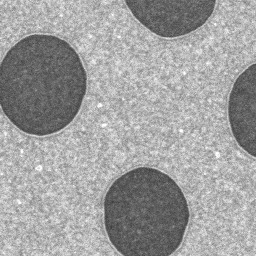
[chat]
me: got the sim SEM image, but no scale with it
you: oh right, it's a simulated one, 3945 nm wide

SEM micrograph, holes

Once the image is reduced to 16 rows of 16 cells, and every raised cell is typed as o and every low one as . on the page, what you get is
oooooooo.....ooo
ooooooooo....ooo
o...oooooooooooo
.....ooooooooooo
.....oooooooooo.
.....ooooooooo..
.....ooooooooo..
o....ooooooooo..
ooooooooooooooo.
ooooooooooooooo.
oooooooooooooooo
ooooooo....ooooo
ooooooo.....oooo
oooooo......oooo
ooooooo.....oooo
ooooooo....ooooo